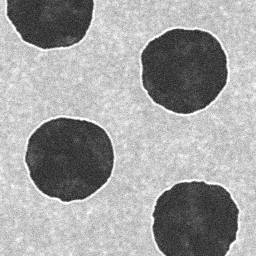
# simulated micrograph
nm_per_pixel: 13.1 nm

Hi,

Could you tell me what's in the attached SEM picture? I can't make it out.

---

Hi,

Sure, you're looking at holes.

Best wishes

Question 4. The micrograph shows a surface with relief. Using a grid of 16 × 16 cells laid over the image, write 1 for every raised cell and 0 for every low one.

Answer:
0000001111111111
1000001111111111
1100011111000011
1111111110000011
1111111110000011
1111111110000011
1111111111000111
1110011111111111
1100000111111111
1100000111111111
1100000111111111
1100000111100111
1111011111000001
1111111111000001
1111111111000001
1111111111000011